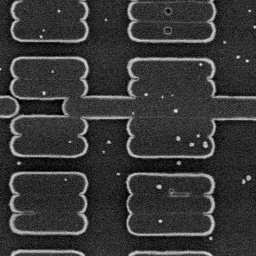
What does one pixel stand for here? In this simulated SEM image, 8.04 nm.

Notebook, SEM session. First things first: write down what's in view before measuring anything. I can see wiring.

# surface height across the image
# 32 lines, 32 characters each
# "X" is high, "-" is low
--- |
--XXXXXXXXX-----XXXXXXXXXXX-----
--XXXXXXXXX-----XXXXXXXXXXX-----
--XXXXXXXXX-----XXXXXXXXXXX-----
--XXXXXXXXX-----XXXXXXXXXXX-----
--XXXXXXXXX-----XXXXXXXXXXX-----
--------------------------------
--------------------------------
--XXXXXXXX-------XXXXXXXXX------
-XXXXXXXXXX-----XXXXXXXXXXX-----
--XXXXXXXXX-----XXXXXXXXXXX-----
-XXXXXXXXXX-----XXXXXXXXXXX-----
--XXXXXXXXX-----XXXXXXXXXXX-----
XX------XXXXXXXXXXXXXXXXXXXXXXXX
XX------XXXXXXXXXXXXXXXXXXXXXXXX
XXXXXXXXXXXXXXXXXXXXXXXXXXXXXXXX
-XXXXXXXXXX-----XXXXXXXXXXX-----
--XXXXXXXXX-----XXXXXXXXXXX-----
--XXXXXXXXX-----XXXXXXXXXXX-----
-XXXXXXXXXX-----XXXXXXXXXXX-----
---XXXXXXX-------XXXXXXXXX------
--------------------------------
--------------------------------
-XXXXXXXXXX-----XXXXXXXXXXX-----
-XXXXXXXXXX-----XXXXXXXXXXX-----
--XXXXXXXX------XXXXXXXXXX------
-XXXXXXXXXX-----XXXXXXXXXXX-----
--XXXXXXXX------XXXXXXXXXX------
-XXXXXXXXXX-----XXXXXXXXXXX-----
--XXXXXXXXX-----XXXXXXXXXXX-----
--------------------------------
--------------------------------
--XXXXXXXX----------------------